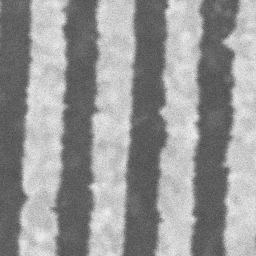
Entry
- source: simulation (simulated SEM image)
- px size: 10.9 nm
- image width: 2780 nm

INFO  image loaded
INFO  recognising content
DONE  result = one or a few lines or trenches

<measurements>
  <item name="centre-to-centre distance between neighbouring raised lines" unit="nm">736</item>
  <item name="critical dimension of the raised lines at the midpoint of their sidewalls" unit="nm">354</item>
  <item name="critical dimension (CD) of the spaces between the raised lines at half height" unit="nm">374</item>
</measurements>